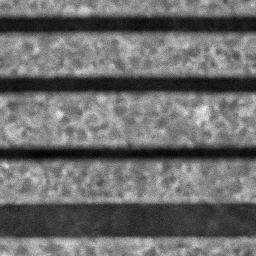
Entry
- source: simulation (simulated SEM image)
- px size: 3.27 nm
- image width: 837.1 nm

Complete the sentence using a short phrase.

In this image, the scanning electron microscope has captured one or a few lines or trenches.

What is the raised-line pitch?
206 nm